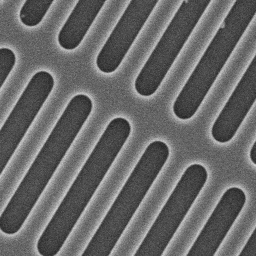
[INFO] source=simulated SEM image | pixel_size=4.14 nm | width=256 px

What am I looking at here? groups of lines, slits or small figures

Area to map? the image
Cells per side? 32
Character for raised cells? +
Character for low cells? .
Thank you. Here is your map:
+++...+++....+++....+++...+++...
+++...+++...+++....+++....+++...
+++..+++....+++...+++....+++...+
++++++++...+++....+++...+++....+
+++++++....+++...+++....+++...++
+++++++...+++....+++...+++....++
..++++++++++....+++...++++...+++
..++++++++++...+++....+++...+++.
..++++++++++...+++...+++....+++.
.+++..+++++++++++....+++...+++..
+++....++++++++++...+++....+++..
+++...+++++++++++..++++...+++...
++....+++..+++++++++++...+++....
++...+++...+++++++++++...+++...+
+....+++...+++++++++++..+++....+
....+++...++++..+++++++++++...++
...+++....+++...++++++++++....++
...+++...+++....+++++++++++..+++
..+++....+++...+++...++++++++++.
..+++...+++....+++...++++++++++.
.+++...+++....+++....+++++++++++
+++....+++...+++....+++...++++++
+++...+++....+++...+++....++++++
++....+++...+++....+++...++++.++
++...+++....+++...+++....+++...+
+...+++....+++....+++...+++....+
....+++...+++....+++...++++...++
...+++....+++...+++....+++...+++
...+++...+++....+++...+++....+++
+++++....+++...+++....+++...+++.
+++++...+++...++++...+++....+++.
+++++..+++....+++...++++...+++..